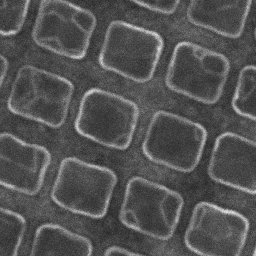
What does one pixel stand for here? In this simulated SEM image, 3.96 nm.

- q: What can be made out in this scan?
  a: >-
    raised bodies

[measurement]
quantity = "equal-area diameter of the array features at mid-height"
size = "230 nm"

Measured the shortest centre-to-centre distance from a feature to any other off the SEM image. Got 70 px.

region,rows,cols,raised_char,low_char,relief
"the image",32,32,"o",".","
oooo.oooo........ooooo..ooooooo.
ooo..oooooo.........o...ooooooo.
ooo..ooooooo............ooooooo.
oo..oooooooo..ooo.........oooo..
....ooooooo..ooooooo.........o..
.....oooooo..ooooooo..oo........
.......oooo..ooooooo..ooooo.....
o............ooooooo.ooooooo....
o..o.........oooooo..ooooooo...o
..oo.oo.........ooo..ooooooo..oo
..oo.oooo............ooooooo..oo
..ooooooo..oo..........oooo...oo
.ooooooo..oooooo.........oo..ooo
.ooooooo..ooooooo............ooo
...ooooo..ooooooo..ooo.........o
......oo..ooooooo..oooooo.......
..........ooooooo..ooooooo......
oo..........oooo..oooooooo.oooo.
ooooo.............ooooooo..ooooo
oooooo............ooooooo..ooooo
oooooo..ooo..........oooo.oooooo
oooo.o.ooooooo............oooooo
ooooo..ooooooo...o.........ooooo
.oooo..ooooooo..ooooo.........oo
.......ooooooo..oooooo..........
.......oooooo..oooooooo..o......
o.........ooo..ooooooo..ooooo...
ooo............ooooooo..ooooooo.
ooo..ooo.........ooooo..ooooooo.
ooo.oooooo.........oo..oooooooo.
oo..ooooooo............ooooooo..
oo..ooooooo..ooo........oooooo..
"